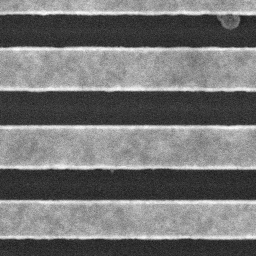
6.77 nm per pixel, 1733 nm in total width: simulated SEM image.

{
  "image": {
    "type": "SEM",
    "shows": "lines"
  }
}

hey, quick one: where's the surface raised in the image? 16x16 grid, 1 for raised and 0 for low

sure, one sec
1111111111111111
0000000000000000
0000000000000000
1111111111111111
1111111111111111
1111111111111111
0000000000000000
0000000000000000
1111111111111111
1111111111111111
1111111111111111
0000000000000000
0000000000000000
1111111111111111
1111111111111111
0000000000000000